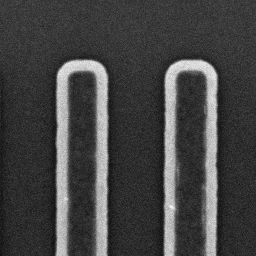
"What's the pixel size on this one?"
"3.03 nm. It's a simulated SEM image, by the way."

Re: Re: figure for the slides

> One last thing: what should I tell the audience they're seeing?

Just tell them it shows one or a few lines or trenches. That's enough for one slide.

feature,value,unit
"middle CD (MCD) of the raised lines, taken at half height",128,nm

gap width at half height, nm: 200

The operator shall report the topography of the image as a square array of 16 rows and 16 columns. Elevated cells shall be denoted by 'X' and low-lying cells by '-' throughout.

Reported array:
----------------
----------------
----------------
----------------
----XX-----XX---
----XX-----XX---
----XX-----XX---
----XX-----XX---
----XX-----XX---
----XX-----XX---
----XX-----XX---
----XX-----XX---
----XX-----XX---
----XX-----XX---
----XX-----XX---
----XX-----XX---